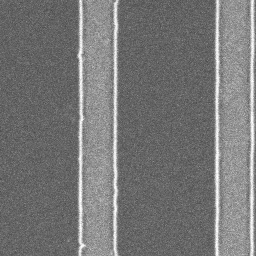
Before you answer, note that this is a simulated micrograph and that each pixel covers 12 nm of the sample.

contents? one or a few lines or trenches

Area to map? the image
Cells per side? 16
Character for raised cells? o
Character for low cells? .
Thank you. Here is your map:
ooooo..ooooooo..
ooooo..ooooooo..
ooooo..ooooooo..
ooooo..ooooooo..
ooooo..ooooooo..
ooooo..ooooooo..
ooooo..ooooooo..
ooooo..ooooooo..
ooooo..ooooooo..
ooooo..ooooooo..
ooooo..ooooooo..
ooooo..ooooooo..
ooooo..ooooooo..
ooooo..ooooooo..
ooooo..ooooooo..
ooooo..ooooooo..